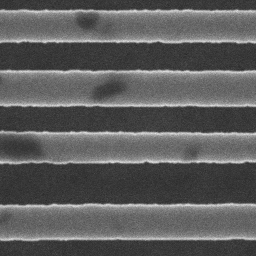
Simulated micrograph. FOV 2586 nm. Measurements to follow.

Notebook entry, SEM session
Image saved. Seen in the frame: lines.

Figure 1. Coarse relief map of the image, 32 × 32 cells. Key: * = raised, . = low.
................................
********************************
********************************
********************************
********************************
................................
................................
................................
................................
********************************
********************************
********************************
********************************
................................
................................
................................
*...............................
********************************
********************************
********************************
................................
................................
................................
................................
................................
............................*...
********************************
********************************
********************************
********************************
................................
................................